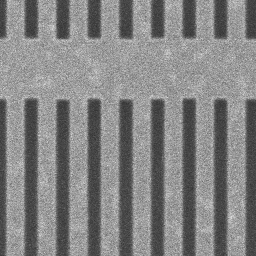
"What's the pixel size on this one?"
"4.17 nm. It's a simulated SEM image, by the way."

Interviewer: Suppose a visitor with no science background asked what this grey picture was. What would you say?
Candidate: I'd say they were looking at parallel lines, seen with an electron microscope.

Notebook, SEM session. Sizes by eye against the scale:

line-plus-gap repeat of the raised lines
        132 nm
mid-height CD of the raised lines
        79.8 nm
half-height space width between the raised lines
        53.2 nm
